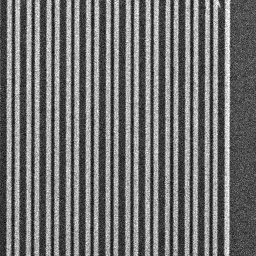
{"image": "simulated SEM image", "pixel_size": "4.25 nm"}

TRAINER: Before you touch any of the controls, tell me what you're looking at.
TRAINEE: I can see parallel lines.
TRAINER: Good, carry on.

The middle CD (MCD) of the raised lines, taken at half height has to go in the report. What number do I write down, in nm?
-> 19.1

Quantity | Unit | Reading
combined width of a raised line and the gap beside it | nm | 42.1